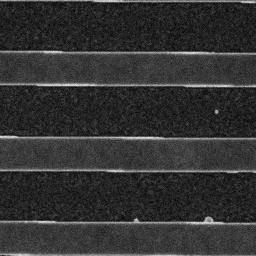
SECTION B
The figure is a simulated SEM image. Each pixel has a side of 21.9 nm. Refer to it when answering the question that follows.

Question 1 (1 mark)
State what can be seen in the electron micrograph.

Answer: lines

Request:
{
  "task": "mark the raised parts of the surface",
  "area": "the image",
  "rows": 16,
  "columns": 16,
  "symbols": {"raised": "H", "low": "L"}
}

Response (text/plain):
LLLLLLLLLLLLLLLL
LLLLLLLLLLLLLLLL
LLLLLLLLLLLLLLLL
HHHHHHHHHHHHHHHH
HHHHHHHHHHHHHHHH
LLLLLLLLLLLLLLLL
LLLLLLLLLLLLLLLL
LLLLLLLLLLLLLLLL
LLLLLLLLLLLLLLLL
HHHHHHHHHHHHHHHH
HHHHHHHHHHHHHHHH
LLLLLLLLLLLLLLLL
LLLLLLLLLLLLLLLL
LLLLLLLLLLLLLLLL
HHHHHHHHHHHHHHHH
HHHHHHHHHHHHHHHH